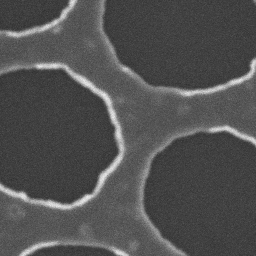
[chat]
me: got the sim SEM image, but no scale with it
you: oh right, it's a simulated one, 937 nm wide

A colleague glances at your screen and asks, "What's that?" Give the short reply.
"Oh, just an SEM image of holes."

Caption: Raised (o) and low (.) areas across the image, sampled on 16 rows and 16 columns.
....oo..........
...ooo..........
ooooooo.........
ooooooo.........
....oooo.......o
.....oooooo..ooo
.......ooooooooo
.......ooooooooo
.......oooo....o
.......ooo......
.......oo.......
......ooo.......
ooo..oooo.......
ooooooooo.......
oooooooooo......
ooo...ooooo.....